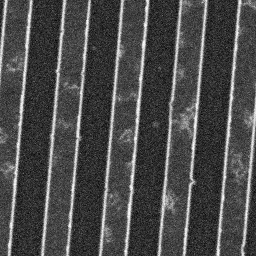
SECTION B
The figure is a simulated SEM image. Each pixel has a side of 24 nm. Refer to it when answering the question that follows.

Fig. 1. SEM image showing parallel lines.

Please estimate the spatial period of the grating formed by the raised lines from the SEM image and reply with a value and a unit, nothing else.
1400 nm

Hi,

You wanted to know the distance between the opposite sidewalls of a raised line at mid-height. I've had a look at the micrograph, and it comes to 0.61 um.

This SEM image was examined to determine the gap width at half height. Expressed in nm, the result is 799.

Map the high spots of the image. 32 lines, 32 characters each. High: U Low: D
DUUUDDDDUUUDDDDUUUDDDDDUUUDDDDUU
DUUUDDDDUUUDDDDUUUDDDDDUUUDDDDUU
DUUUDDDDUUUDDDDUUUDDDDDUUUDDDDUU
UUUUDDDDUUUDDDDUUUDDDDUUUDDDDDUU
UUUUDDDDUUUDDDDUUUDDDDUUUDDDDDUU
UUUDDDDDUUUDDDDUUUDDDDUUUDDDDUUU
UUUDDDDDUUUDDDDUUUDDDDUUUDDDDUUU
UUUDDDDUUUDDDDDUUUDDDDUUUDDDDUUU
UUUDDDDUUUDDDDDUUUDDDDUUUDDDDUUU
UUUDDDDUUUDDDDDUUUDDDDUUUDDDDUUU
UUUDDDDUUUDDDDUUUUDDDDUUUDDDDUUU
UUUDDDDUUUDDDDUUUUDDDDUUUDDDDUUU
UUUDDDDUUUDDDDUUUDDDDDUUUDDDDUUU
UUUDDDDUUUDDDDUUUDDDDUUUUDDDDUUU
UUUDDDDUUUDDDDUUUDDDDUUUDDDDDUUU
UUUDDDDUUUDDDDUUUDDDDUUUUDDDDUUU
UUDDDDDUUUDDDDUUUDDDDUUUDDDDDUUU
UUDDDDDUUUDDDDUUUDDDDUUUDDDDUUUU
UUDDDDDUUUDDDDUUUDDDDUUUDDDDUUUD
UUDDDDUUUDDDDDUUUDDDDUUUDDDDUUUD
UUDDDDUUUDDDDDUUUDDDDUUUDDDDUUUD
UUDDDDUUUDDDDUUUUDDDDUUUDDDDUUUD
UUDDDDUUUDDDDUUUUDDDDUUUDDDDUUUD
UUDDDDUUUDDDDUUUUDDDDUUUDDDDUUUD
UUDDDDUUUDDDDUUUDDDDDUUUDDDDUUUD
UUDDDDUUUDDDDUUUDDDDDUUUDDDDUUUD
UUDDDDUUUDDDDUUUDDDDUUUDDDDDUUUD
UUDDDDUUUDDDDUUUDDDDUUUDDDDDUUUD
UDDDDDUUUDDDDUUUDDDDUUUDDDDUUUUD
UDDDDDUUUDDDDUUUDDDDUUUDDDDUUUUD
UDDDDUUUUDDDDUUUDDDDUUUDDDDUUUDD
UDDDDUUUUDDDDUUUDDDDUUUDDDDUUUDD